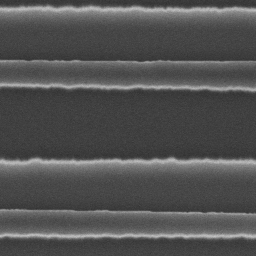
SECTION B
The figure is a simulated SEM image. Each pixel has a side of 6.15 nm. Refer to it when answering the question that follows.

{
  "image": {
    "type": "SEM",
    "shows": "lines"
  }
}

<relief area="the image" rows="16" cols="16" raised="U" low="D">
DDDDDDDDDDDDDDDD
UUUUUUUUUUUUUUUU
UUUUUUUUUUUUUUUU
UUUUUUUUUUUUUUUU
UUUUUUUUUUUUUUUU
DDDDDDDDDDDDDUUU
DDDDDDDDDDDDDDDD
DDDDDDDDDDDDDDDD
DDDDDDDDDDDDDDDD
DDDDDDDDDDDDDDDD
UUUUUUUUUUUUUUUU
UUUUUUUUUUUUUUUU
UUUUUUUUUUUUUUUU
UUUUUUUUUUUUUUUU
UUUUUUUUUUUUUUUU
DDDDDDDDDDDDDDDD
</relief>